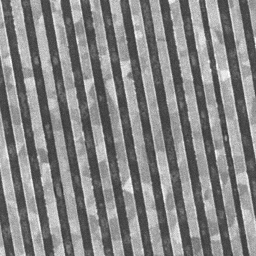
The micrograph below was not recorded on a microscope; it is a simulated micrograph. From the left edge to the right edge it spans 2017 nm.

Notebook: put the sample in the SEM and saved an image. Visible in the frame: parallel lines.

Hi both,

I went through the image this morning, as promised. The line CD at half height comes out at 75.7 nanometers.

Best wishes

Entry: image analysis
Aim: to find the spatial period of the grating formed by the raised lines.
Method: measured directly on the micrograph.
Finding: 153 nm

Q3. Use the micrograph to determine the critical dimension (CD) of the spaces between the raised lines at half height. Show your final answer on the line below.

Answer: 75.7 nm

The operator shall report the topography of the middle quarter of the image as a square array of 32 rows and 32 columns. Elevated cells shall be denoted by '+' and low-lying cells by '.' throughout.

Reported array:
++..+++..+++..+++..++...++...+++
++..+++...++..+++..+++..+++..+++
++...++...++...++...++...++...++
++...++...++...++...++...++...++
++...++...++...++...++...++...++
+++..++...+++..++...++...++...++
+++...++..+++..+++..+++..+++..++
.++...++...++...++..+++...++..++
.++...++...++...++...++...++...+
.++...++...++...++...++...++...+
.++...++...++...++...++...++...+
.+++..+++..+++..+++..++...++...+
.+++..+++..+++..+++..+++..+++..+
..++...++...++...++..+++...++..+
..++...++...++...++...++...++...
..++...++...++...++...++...++...
..+++..+++..+++..++...++...++...
..+++..+++..+++..+++..++...+++..
...++...++...++..+++..+++..+++..
...++...++...++...++..+++...++..
...++...++...++...++...++...++..
...++...+++..++...++...++...++..
+..+++..++...+++..++...++...++..
+..+++...++..+++..+++..+++..+++.
+...++...++...++..+++..+++..+++.
+...++...++...++...++...++...++.
+...++...++...++...++...++...++.
++..++...++...++...++...++...++.
++..+++..++...+++..++...++...++.
++..+++..+++..+++..+++..+++..+++
++...++...++...++...++..+++...++
++...++...++...++...++...++...++